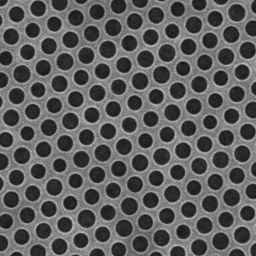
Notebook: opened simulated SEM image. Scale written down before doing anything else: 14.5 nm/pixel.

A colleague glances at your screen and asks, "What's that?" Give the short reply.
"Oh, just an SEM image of a regular array of holes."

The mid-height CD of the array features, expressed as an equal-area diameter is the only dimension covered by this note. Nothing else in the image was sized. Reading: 16.3 px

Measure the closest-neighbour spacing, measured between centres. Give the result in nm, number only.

323